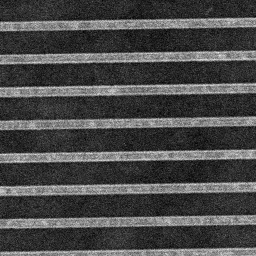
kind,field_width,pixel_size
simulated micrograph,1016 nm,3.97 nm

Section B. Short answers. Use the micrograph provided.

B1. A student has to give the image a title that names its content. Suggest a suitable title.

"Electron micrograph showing parallel lines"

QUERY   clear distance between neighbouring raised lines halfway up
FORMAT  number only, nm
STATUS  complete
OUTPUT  101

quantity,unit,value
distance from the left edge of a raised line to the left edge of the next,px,32.9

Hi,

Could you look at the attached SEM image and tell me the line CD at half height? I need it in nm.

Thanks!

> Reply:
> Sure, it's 31.2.